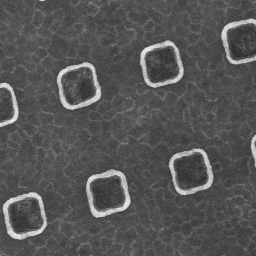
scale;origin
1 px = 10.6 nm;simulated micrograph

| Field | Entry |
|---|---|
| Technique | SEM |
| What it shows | raised bodies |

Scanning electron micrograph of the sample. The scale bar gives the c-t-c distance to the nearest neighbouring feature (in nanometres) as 904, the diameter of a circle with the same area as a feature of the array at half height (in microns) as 0.439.